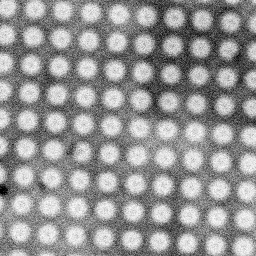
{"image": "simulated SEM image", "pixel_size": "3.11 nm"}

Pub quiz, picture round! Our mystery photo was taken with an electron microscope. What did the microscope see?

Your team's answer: an array of small figures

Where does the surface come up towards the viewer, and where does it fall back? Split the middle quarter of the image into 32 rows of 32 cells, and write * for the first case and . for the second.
*...****...****...****....**....
*...****..*****..*****...****...
....****...****..*****..*****...
...........***....****...****..*
..........................**....
................................
....***....**...................
*..*****..****...****....**.....
*..*****..*****..*****..****....
...****...****...*****..****...*
...........***...****...****...*
.........................**....*
................................
...****...***...................
...****...****...****....**.....
..*****..*****...****...****...*
...****...****...****..*****..**
..........***....****...****..**
........................***....*
................................
...***....**....................
..*****..****....***....**......
..*****..*****..*****..****....*
..****...*****..*****..*****..**
..........***....***...****...**
........................***...**
................................
..****....**....................
..****...****...****...***......
..****...****...****...****...**
..****...****...****...****...**
..........**....****...****..***